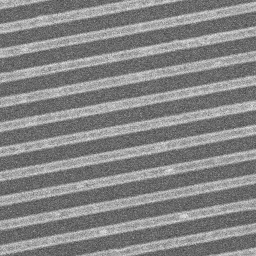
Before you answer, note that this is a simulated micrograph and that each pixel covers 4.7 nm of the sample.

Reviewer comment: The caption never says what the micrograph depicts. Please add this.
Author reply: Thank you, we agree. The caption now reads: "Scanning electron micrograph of parallel lines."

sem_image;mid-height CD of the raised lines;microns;0.0399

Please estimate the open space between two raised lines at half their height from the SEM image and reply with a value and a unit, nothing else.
75 nanometres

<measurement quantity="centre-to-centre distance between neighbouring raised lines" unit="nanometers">114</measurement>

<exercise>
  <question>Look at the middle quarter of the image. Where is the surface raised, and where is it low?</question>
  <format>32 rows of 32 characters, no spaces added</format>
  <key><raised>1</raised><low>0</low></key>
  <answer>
11111100000000000000000000001111
10000000000000000000001111111111
00000000000000000111111111111000
00000000000111111111110000000000
00000011111111111100000000000000
00111111111110000000000000000000
11111100000000000000000000000111
11000000000000000000000111111111
00000000000000000011111111111000
00000000000011111111111000000000
00000001111111111100000000000000
00111111111110000000000000000000
11111110000000000000000000000011
11000000000000000000000011111111
00000000000000000001111111111100
00000000000000011111111110000000
00000000011111111110000000000000
00011111111111000000000000000000
11111111000000000000000000000001
11100000000000000000000001111111
00000000000000000000111111111110
00000000000000011111111111000000
00000000011111111111000000000000
00001111111111100000000000000000
11111111100000000000000000000000
11110000000000000000000000011111
00000000000000000000011111111111
00000000000000001111111111100000
00000000001111111111100000000000
00000111111111110000000000000000
11111111110000000000000000000000
11111000000000000000000000001111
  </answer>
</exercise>